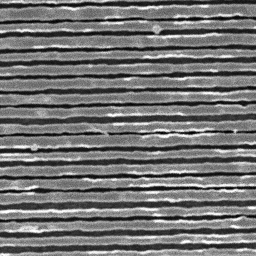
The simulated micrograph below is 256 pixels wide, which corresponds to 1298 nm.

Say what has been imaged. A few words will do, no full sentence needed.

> parallel lines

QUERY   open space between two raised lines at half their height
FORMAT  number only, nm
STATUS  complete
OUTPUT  24.1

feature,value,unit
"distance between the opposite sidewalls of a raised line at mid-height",9.51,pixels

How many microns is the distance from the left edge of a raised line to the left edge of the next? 0.0722